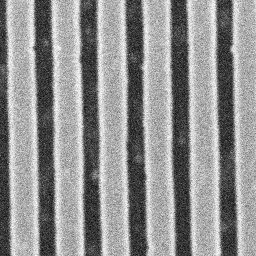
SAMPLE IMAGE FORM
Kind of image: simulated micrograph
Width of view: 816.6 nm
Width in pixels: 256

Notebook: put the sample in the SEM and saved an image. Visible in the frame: parallel lines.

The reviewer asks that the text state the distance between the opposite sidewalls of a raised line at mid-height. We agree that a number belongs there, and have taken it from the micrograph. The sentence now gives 86.1 nanometers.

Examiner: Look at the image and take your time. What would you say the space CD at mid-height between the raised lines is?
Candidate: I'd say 18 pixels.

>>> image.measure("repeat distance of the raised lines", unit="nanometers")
144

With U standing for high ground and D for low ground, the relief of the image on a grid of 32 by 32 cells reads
DUUUDDDUUUDDUUUDDDUUUDDUUUUDDUUU
DUUUDDDUUUDDUUUUDDUUUDDDUUUDDUUU
DUUUDDDUUUDDUUUUDDUUUDDDUUUDDUUU
DUUUDDDUUUDDUUUUDDUUUDDDUUUDDUUU
DUUUDDDUUUDDUUUUDDUUUDDDUUUDDUUU
DUUUDDDUUUDDUUUUDDUUUDDDUUUDDUUU
DUUUDDDUUUDDUUUUDDUUUDDDUUUDDUUU
DUUUDDDUUUDDUUUUDDUUUDDDUUUDDUUU
DUUUDDDUUUDDUUUUDDUUUDDDUUUDDUUU
DUUUDDDUUUDDUUUUDDUUUDDDUUUDDUUU
DUUUDDDUUUDDUUUUDDUUUDDDUUUDDUUU
DUUUDDDUUUDDUUUUDDUUUDDDUUUDDUUU
DUUUDDDUUUDDUUUUDDUUUDDDUUUDDUUU
DUUUDDDUUUDDUUUUDDUUUDDDUUUDDUUU
DUUUDDDUUUDDUUUUDDUUUDDDUUUDDUUU
DUUUUDDUUUDDDUUUDDUUUDDDUUUDDUUU
DUUUUDDUUUDDDUUUDDUUUDDDUUUDDUUU
DUUUUDDUUUDDDUUUDDUUUDDDUUUDDUUU
DUUUUDDUUUDDDUUUDDUUUDDDUUUDDUUU
DUUUUDDUUUDDDUUUDDUUUDDDUUUDDUUU
DUUUUDDUUUDDDUUUDDUUUDDDUUUDDUUU
DUUUUDDUUUDDDUUUDDUUUDDDUUUDDDUU
DUUUUDDUUUDDDUUUDDUUUUDDUUUDDDUU
DUUUUDDUUUDDDUUUDDUUUUDDUUUDDDUU
DUUUUDDUUUDDDUUUDDUUUUDDUUUDDDUU
DUUUUDDUUUDDDUUUDDUUUUDDUUUDDDUU
DUUUUDDUUUDDDUUUDDUUUUDDUUUDDDUU
DUUUUDDUUUDDDUUUDDUUUUDDUUUDDDUU
DUUUUDDUUUDDDUUUDDUUUUDDUUUDDDUU
DUUUUDDUUUDDDUUUDDUUUUDDUUUDDDUU
DUUUUDDUUUDDDUUUDDDUUUDDUUUDDDUU
DUUUUDDUUUDDDUUUDDUUUUDDUUUDDDUU